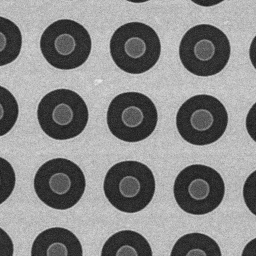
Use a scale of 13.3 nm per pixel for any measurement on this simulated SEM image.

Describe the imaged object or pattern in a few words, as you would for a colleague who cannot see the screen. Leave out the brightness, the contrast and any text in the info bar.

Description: an array of small figures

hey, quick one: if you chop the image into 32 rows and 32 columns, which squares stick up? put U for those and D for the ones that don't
UUUUUUUUUUUUUUUUUUUUUUUUDDDUUUUU
UUUUUUUUUUUUUUUUUUUUUUUUUUUUUUUU
DUUUUUUDDUUUUUUUUUUUUUUUUUUUUUUU
DDUUUUDDDDDUUUUDDDDUUUUUDDDUUUUU
DDDUUDDDUDDUUUDDDDDDUUUDDDDDUUUU
UDDUUDDUUDDUUUDDUUDDUUDDDUDDDUUD
DDDUUDDUUDDUUUDDUUDDUUDDUUUDDUUD
DDUUUUDDDDDUUUDDDDDDUUUDDUDDDUUD
UUUUUUUDDDUUUUUDDDDUUUUDDDDDUUUU
UUUUUUUUUUUUUUUUUUUUUUUUUDUUUUUU
UUUUUUUUUUUUUUUUUUUUUUUUUUUUUUUU
DUUUUUDDDUUUUUUUDUUUUUUUUUUUUUUU
DDUUUDDDDDDUUUDDDDDUUUUDDDDUUUUU
DDUUUDDUUDDUUDDDUDDDUUDDDDDDUUUD
DDUUUDDUUDDUUDDUUUDDUUDDUUDDDUUD
DDUUUDDUDDDUUDDDUDDDUUDDUUDDUUUD
DUUUUDDDDDUUUUDDDDDUUUDDDDDDUUUD
UUUUUUUDUUUUUUUDDDUUUUUDDDDUUUUU
UUUUUUUUUUUUUUUUUUUUUUUUUUUUUUUU
UUUUUUUUUUUUUUUUUUUUUUUUUUUUUUUU
DUUUUDDDDDUUUUDDDDUUUUUUUUUUUUUU
DDUUDDDDDDUUUDDDDDDUUUUDDDDUUUUU
DDUUDDUUUDDUUDDUUDDUUUDDDDDDUUUD
DDUUDDUUUDDUUDDUUDDUUUDDUUDDUUDD
DUUUUDDDDDUUUDDDUDDUUUDDUUDDUUDD
UUUUUUDDDDUUUUDDDDDUUUDDDDDUUUUD
UUUUUUUUUUUUUUUDDUUUUUUDDDUUUUUD
UUUUUUUUUUUUUUUUUUUUUUUUUUUUUUUU
UUUUUUDDUUUUUUUUUUUUUUUUUUUUUUUU
DUUUUDDDDDUUUUDDDDUUUUUDDDUUUUUU
DDUUDDDUDDUUUDDDDDDUUUDDDDDUUUUD
DDUUDDUUDDUUUDDUUDDUUDDDUDDDUUDD